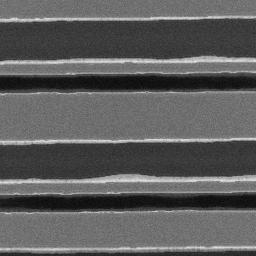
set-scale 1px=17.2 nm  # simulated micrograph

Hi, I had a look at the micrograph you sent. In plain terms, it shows lines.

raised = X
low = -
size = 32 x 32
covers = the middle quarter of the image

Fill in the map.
XXXXXXXXXXXXXXXXXXXXXXXXXXXXXXXX
XXXXXXXXXXXXXXXXXXXXXXXXXXXXXXXX
XXXX-----X----------------------
--------------------------------
--------------------------------
--------------------------------
--------------------------------
XXXXXXXXXXXXXXXXXXXXXXXXXXXXXXXX
XXXXXXXXXXXXXXXXXXXXXXXXXXXXXXXX
XXXXXXXXXXXXXXXXXXXXXXXXXXXXXXXX
XXXXXXXXXXXXXXXXXXXXXXXXXXXXXXXX
XXXXXXXXXXXXXXXXXXXXXXXXXXXXXXXX
XXXXXXXXXXXXXXXXXXXXXXXXXXXXXXXX
XXXXXXXXXXXXXXXXXXXXXXXXXXXXXXXX
XXXXXXXXXXXXXXXXXXXXXXXXXXXXXXXX
XXXXXXXXXXXXXXXXXXXXXXXXXXXXXXXX
XXXXXXXXXXXXXXXXXXXXXXXXXXXXXXXX
XXXXXXXXXXXXXXXXXXXXXXXXXXXXXXXX
XXXXXXXXXXXXXXXXXXXXXXXXXXXXXXXX
--------------------------------
--------------------------------
--------------------------------
--------------------------------
--------------------------------
--------------------------------
--------------------------------
--------------------------------
--------------------------------
--------------------------------
XXXXXXXXXXXXXXXXXXXXXXXXXXXXXXXX
XXXXXXXXXXXXXXXXXXXXXXXXXXXXXXXX
XXXXXXXXXXXXXXXXXXXXXXXXXXXXXXXX